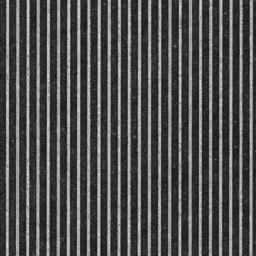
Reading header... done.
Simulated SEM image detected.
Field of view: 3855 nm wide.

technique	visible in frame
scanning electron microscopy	parallel lines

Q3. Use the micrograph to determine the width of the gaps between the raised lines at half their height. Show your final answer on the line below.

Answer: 0.12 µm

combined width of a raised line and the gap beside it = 0.153 microns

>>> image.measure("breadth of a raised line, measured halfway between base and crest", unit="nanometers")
26.4